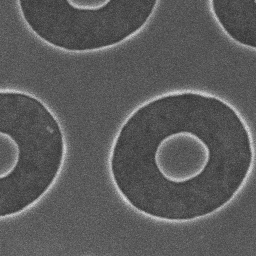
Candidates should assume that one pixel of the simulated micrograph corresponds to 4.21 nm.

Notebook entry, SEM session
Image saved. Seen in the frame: ring-shaped grooves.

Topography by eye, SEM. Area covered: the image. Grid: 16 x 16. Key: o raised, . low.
o.........ooo...
oo.......ooooo..
ooo.....ooooooo.
oooooooooooooooo
oooooooooooooooo
oooooooooooooooo
...oooooo.....oo
...ooooo.......o
....ooo....o....
o...ooo...ooo...
o...ooo...ooo...
...oooo........o
..oooooo......oo
oooooooooo...ooo
oooooooooooooooo
oooooooooooooooo